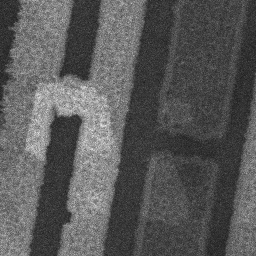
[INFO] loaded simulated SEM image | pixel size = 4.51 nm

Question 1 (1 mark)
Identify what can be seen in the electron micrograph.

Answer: one or a few lines or trenches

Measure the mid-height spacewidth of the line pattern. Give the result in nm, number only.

169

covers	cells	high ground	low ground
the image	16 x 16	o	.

.ooo...oo..oooo.
.ooo..ooo..oooo.
.ooo..oo...oooo.
.ooo..oo...oooo.
.ooo..oo...oooo.
.ooooooo..oooo..
oooooooo..oooo..
ooo..ooo..oooo..
ooo..oo.....o...
ooo..oo........o
oo...oo...ooo..o
oo...oo..oooo..o
oo..ooo..oooo..o
oo...oo..oooo..o
oo..oo...oooo..o
oo..oo...oooo.oo